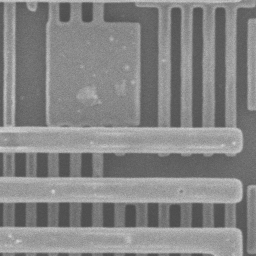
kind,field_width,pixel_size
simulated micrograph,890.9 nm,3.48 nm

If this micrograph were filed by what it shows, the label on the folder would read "wiring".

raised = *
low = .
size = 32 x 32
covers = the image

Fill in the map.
................................
................................
................................
................................
................................
................................
................................
................................
................................
................................
................................
................................
................................
................................
................................
................................
******************************..
******************************..
******************************..
................................
................................
................................
******************************..
******************************..
******************************..
................................
................................
................................
***.............................
******************************..
******************************..
***.**************************..